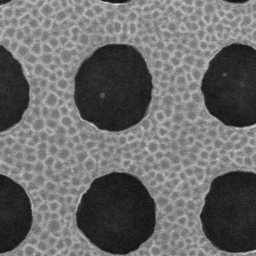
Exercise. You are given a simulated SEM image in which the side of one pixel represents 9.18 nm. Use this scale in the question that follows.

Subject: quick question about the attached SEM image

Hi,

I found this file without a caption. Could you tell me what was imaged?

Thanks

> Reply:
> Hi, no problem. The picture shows holes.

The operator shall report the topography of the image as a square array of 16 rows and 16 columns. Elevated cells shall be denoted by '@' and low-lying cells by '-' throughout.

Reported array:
@@@@@@@@@@@@@@@@
@@@@@@@@@@@@@@@@
@@@@@@@@@@@@@@@@
-@@@@@---@@@@---
-@@@@----@@@@---
--@@@-----@@@---
--@@@----@@@@---
-@@@@----@@@@@--
@@@@@@@@@@@@@@@@
@@@@@@@@@@@@@@@@
@@@@@@@@@@@@@@@@
-@@@@@---@@@@---
--@@@-----@@@---
--@@@-----@@@---
--@@@-----@@@---
-@@@@@---@@@@@--